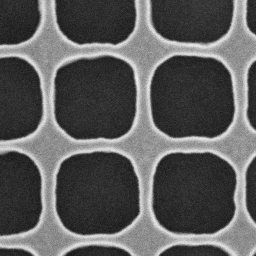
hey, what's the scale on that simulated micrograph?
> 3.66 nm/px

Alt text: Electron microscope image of holes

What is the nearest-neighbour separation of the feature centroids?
351 nm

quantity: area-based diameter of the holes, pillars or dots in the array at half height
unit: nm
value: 322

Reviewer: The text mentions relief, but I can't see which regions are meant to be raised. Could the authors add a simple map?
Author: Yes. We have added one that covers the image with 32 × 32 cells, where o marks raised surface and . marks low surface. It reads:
.....oo..........oo..........oo.
.....oo..........oo..........oo.
.....oo..........oo..........oo.
.....oo..........oo..........oo.
....oooo........oooo........oooo
..oooooooo.ooo.oooooooooo.oooooo
oooooooooooooooooooooooooooooooo
...oooooo......oooooo......ooooo
....ooo..........ooo........ooo.
.....oo..........oo..........oo.
.....oo..........oo..........oo.
.....oo..........oo..........oo.
.....oo..........oo..........oo.
.....oo..........oo..........oo.
.....oo..........oo..........oo.
.....oo..........oo..........oo.
....oooo........oooo........oooo
.ooooooooooooooooooooooooooooooo
oooooooooooooooooooooooooooooooo
...oooooo......oooooo......ooooo
....oooo.........ooo.........oo.
.....oo..........oo..........oo.
.....oo..........oo...........o.
.....oo..........oo...........o.
.....oo..........oo..........oo.
.....oo..........oo..........oo.
.....oo..........oo..........oo.
.....ooo.........ooo.........ooo
....oooo........oooo........oooo
oooooooooooooooooooooooooooooooo
oooooooooooooooooooooo.ooooooooo
....ooooo.......oooo........oooo